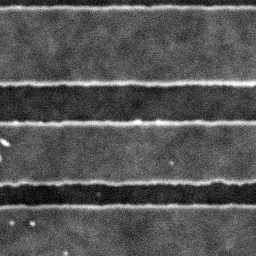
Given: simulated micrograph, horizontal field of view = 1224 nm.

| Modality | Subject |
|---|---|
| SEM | lines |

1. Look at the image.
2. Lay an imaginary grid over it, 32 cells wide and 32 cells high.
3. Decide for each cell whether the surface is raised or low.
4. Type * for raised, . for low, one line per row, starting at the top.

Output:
................................
********************************
********************************
********************************
********************************
********************************
********************************
********************************
********************************
********************************
***.***.****.**...****.......***
................................
................................
................................
................................
********************************
********************************
********************************
********************************
********************************
********************************
********************************
********************************
................................
................................
................................
********************************
********************************
********************************
********************************
********************************
********************************